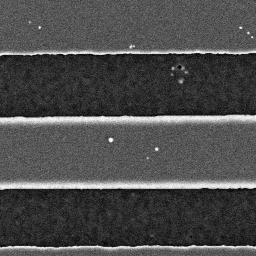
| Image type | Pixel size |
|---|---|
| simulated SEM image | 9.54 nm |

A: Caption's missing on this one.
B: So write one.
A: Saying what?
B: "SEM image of lines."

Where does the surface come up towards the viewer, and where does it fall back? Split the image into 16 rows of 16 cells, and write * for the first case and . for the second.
****************
****************
****************
................
................
................
................
****************
****************
****************
****************
****************
................
................
................
****************